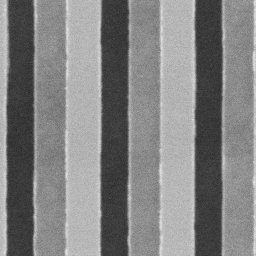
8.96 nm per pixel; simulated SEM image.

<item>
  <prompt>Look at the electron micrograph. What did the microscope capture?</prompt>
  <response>lines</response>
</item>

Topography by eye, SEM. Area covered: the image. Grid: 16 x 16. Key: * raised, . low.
..****..****..**
..****..****..**
..****..****..**
..****..****..**
..****..****..**
..****..****..**
..****..****..**
..****..****..**
..****..****..**
..****..****..**
..****..****..**
..****..****..**
..****..****..**
..****..****..**
..****..****..**
..****..****..**